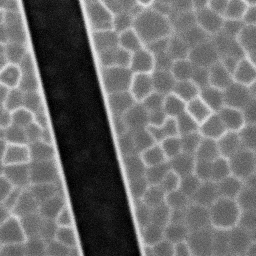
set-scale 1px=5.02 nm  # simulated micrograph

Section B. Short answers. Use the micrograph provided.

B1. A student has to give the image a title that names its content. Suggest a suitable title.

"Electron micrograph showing one or a few lines or trenches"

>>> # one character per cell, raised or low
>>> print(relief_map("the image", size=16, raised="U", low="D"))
UDDDDUUUUUUUUUUU
UUDDDUUUUUUUUUUU
UUDDDDUUUUUUUUUU
UUDDDDUUUUUUUUUU
UUDDDDUUUUUUUUUU
UUUDDDUUUUUUUUUU
UUUDDDDUUUUUUUUU
UUUDDDDUUUUUUUUU
UUUDDDDUUUUUUUUU
UUUUDDDUUUUUUUUU
UUUUDDDDUUUUUUUU
UUUUDDDDUUUUUUUU
UUUUDDDDUUUUUUUU
UUUUDDDDUUUUUUUU
UUUUUDDDDUUUUUUU
UUUUUDDDDUUUUUUU